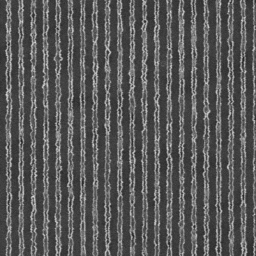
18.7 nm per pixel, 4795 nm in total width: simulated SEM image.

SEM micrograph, parallel lines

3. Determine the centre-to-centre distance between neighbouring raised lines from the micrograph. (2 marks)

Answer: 231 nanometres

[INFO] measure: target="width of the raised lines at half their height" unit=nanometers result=70.3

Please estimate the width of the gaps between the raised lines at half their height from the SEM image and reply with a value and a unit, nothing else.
159 nm